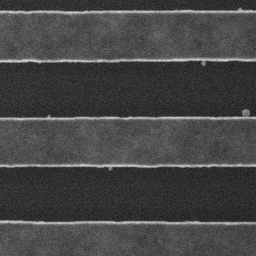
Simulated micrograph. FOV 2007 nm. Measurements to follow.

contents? lines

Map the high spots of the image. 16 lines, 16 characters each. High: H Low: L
LLLLLLLLLLLLLLLL
HHHHHHHHHHHHHHHH
HHHHHHHHHHHHHHHH
HHHHHHHHHHHHHHHH
LLLLLLLLLLLLLLLL
LLLLLLLLLLLLLLLL
LLLLLLLLLLLLLLLL
HHHHHHHHHHHHHHHH
HHHHHHHHHHHHHHHH
HHHHHHHHHHHHHHHH
LLLLLLLLLLLLLLLL
LLLLLLLLLLLLLLLL
LLLLLLLLLLLLLLLL
LLLLLLLLLLLLLLLL
HHHHHHHHHHHHHHHH
HHHHHHHHHHHHHHHH